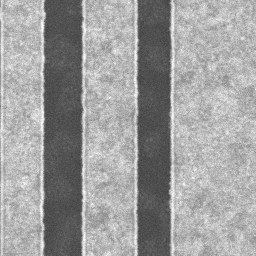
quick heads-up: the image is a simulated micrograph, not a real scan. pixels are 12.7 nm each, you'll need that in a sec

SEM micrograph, one or a few lines or trenches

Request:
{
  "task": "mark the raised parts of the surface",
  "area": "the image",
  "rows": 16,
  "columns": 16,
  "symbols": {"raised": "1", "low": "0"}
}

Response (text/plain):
1110011100011111
1110011100011111
1110011110011111
1110011100011111
1110011100011111
1110011100011111
1110011110011111
1110011100011111
1110011110011111
1110011110011111
1110011100011111
1110011100011111
1110011100011111
1110011100011111
1110011110011111
1110011110011111